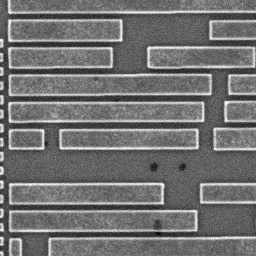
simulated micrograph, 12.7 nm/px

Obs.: wiring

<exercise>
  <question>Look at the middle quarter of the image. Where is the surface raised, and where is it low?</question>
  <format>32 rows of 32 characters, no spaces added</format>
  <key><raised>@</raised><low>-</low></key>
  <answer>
@@@@@@@@@@@@---------@@@@@@@@@@@
--------------------------------
--------------------------------
@@@@@@@@@@@@@@@@@@@@@@@@@@@@@@@@
@@@@@@@@@@@@@@@@@@@@@@@@@@@@@@@@
@@@@@@@@@@@@@@@@@@@@@@@@@@@@@@@@
@@@@@@@@@@@@@@@@@@@@@@@@@@@@@@@@
@@@@@@@@@@@---------------------
--------------------------------
--------------------------------
@@@@@@@@@@@@@@@@@@@@@@@@@@@@@@@@
@@@@@@@@@@@@@@@@@@@@@@@@@@@@@@@@
@@@@@@@@@@@@@@@@@@@@@@@@@@@@@@@@
@@@@@@@@@@@@@@@@@@@@@@@@@@@@@@@@
--------------------------------
--------------------------------
@@@@@@@@@@@@@@@@@@@@@@@@@@@@@@@@
@@@@@@@@@@@@@@@@@@@@@@@@@@@@@@@@
@@@@@@@@@@@@@@@@@@@@@@@@@@@@@@@@
@@@@@@@@@@@@@@@@@@@@@@@@@@@@@@@@
@@@@@@@@@@@@@@@@@@@@@@@@@@@@@@@@
--------------------------------
--------------------------------
--------------------------------
--------------------------------
--------------------------------
--------------------------------
--------------------------------
--------------------------------
--------------------------------
@@@@@@@@@@@@@@@@@@@@@@@@@-------
@@@@@@@@@@@@@@@@@@@@@@@@@-------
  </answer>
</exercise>